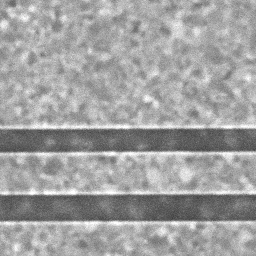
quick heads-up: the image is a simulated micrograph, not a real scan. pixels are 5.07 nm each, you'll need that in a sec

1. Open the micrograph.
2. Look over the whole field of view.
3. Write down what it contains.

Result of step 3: one or a few lines or trenches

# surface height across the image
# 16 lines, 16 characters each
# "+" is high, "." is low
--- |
++++++++++++++++
++++++++++++++++
++++++++++++++++
++++++++++++++++
++++++++++++++++
++++++++++++++++
++++++++++++++++
++++++++++++++++
................
........+.......
++++++++++++++++
++++++++++++++++
................
................
++++++++++++++++
++++++++++++++++